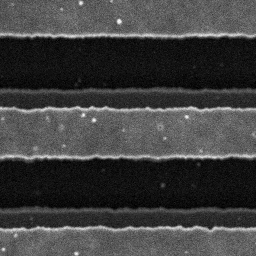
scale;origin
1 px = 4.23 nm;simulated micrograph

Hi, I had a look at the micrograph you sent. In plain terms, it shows lines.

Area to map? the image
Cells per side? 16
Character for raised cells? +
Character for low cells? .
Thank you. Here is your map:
++++++++++++++++
++++++++++++++++
................
................
................
................
................
++++++++++++++++
++++++++++++++++
++++++++++++++++
................
................
................
................
++++++++++++++++
++++++++++++++++